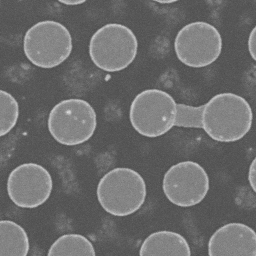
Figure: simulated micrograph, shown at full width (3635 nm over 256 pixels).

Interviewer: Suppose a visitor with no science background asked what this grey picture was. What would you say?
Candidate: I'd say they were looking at raised bodies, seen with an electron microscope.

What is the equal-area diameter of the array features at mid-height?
651 nm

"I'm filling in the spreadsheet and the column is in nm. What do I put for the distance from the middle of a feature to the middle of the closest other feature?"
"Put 935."